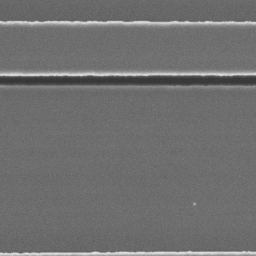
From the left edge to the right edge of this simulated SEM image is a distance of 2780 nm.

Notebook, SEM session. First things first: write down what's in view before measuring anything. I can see lines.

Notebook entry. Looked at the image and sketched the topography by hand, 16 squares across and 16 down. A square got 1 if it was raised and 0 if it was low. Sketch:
0000000000000000
1111111111111111
1111111111111111
1111111111111111
1111111111111111
0000000000000000
0000000000000000
0000000000000000
0000000000000000
0000000000000000
0000000000000000
0000000000000000
0000000000000000
0000000000000000
0000000000000000
0000000000000000